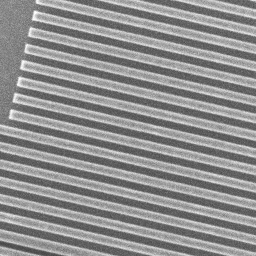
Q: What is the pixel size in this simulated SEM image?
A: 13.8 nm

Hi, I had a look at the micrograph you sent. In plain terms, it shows parallel lines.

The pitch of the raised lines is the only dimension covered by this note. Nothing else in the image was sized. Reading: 234 nm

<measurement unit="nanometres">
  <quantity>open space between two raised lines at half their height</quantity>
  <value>109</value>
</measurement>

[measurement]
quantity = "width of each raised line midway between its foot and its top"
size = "0.124 microns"